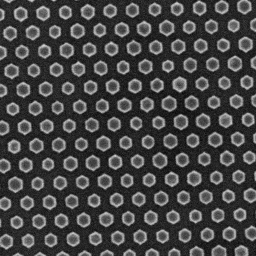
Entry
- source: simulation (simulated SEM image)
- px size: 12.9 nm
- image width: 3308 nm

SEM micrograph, a regular array of raised bodies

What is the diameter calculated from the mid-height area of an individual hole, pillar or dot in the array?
168 nanometers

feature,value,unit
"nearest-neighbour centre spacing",282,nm